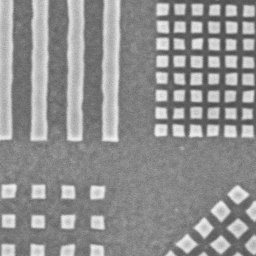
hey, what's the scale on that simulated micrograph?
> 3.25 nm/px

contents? groups of lines, slits or small figures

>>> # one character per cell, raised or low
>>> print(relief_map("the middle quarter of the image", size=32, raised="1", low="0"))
01111000001110000000000111001100
01111000001110000000000000000000
01111000001111000000000111001100
01111000001111000000000111001100
01111000001110000000000111001100
01111000001110000000000000000000
01111000001110000000000000000000
01111000001110000000000111001100
01111000001110000000000111001100
01110000001110000000000000000000
01110000001110000000000000000000
01110000001110000000000111001100
01111000001110000000000111011100
01111000001110000000000111011100
01110000001110000000000000000000
01110000001110000000000111011100
01110000001110000000000111011100
01110000001110000000000111011100
01110000001110000000000000000000
00000000000000000000000000000000
00000000000000000000000000000000
00000000000000000000000000000000
00000000000000000000000000000000
00000000000000000000000000000000
00000000000000000000000000000000
00000000000000000000000000000000
00000000000000000000000000000000
00000000000000000000000000000000
00000000000000000000000000000000
00000000000000000000000000000000
00000000000000000000000000000000
11100001110000000000000000000000